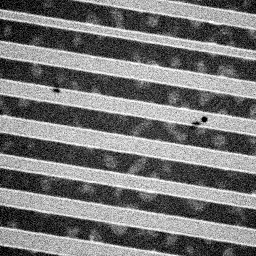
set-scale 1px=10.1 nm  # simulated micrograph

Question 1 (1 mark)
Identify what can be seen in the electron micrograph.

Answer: parallel lines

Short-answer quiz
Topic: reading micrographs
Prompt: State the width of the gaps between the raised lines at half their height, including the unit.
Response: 141 nm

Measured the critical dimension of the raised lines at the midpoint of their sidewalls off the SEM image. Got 226 nanometers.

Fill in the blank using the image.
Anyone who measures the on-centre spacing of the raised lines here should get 361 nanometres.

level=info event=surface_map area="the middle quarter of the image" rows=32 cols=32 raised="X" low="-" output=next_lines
---------------------XXXXXXXXXXX
XXXXX-----------------------XXXX
XXXXXXXXXXX---------------------
XXXXXXXXXXXXXXXXXX--------------
XXXXXXXXXXXXXXXXXXXXXXX---------
XXXXXXXXXXXXXXXXXXXXXXXXXXXXX---
XXXXXXXXXXXXXXXXXXXXXXXXXXXXXXXX
-------XXXXXXXXXXXXXXXXXXXXXXXXX
-------------XXXXXXXXXXXXXXXXXXX
-------------------XXXXXXXXXXXXX
XXX----------------------XXXXX-X
XXXXXXXXXX---------------------X
XXXXXXXXXXXXXXXX----------------
XXXXXXXXXXXXXXXXXXXXXX----------
XXXXXXXXXXXXXXXXXXXXXXXXXXX-----
XXXXXXXXXXXXXXXXXXXXXXXXXXXXXXXX
------XXXXXXXXXXXXXXXXXXXXXXXXXX
------------XXXXXXXXXXXXXXXXXXXX
------------------XXXXXXXXXXXXXX
------------------------XXXXXXXX
XXXXXX------------------------XX
XXXXXXXXXXXXX-------------------
XXXXXXXXXXXXXXXXXXX-------------
XXXXXXXXXXXXXXXXXXXXXXXXX-------
XXXXXXXXXXXXXXXXXXXXXXXXXXXXXXX-
--XXXXXXXXXXXXXXXXXXXXXXXXXXXXXX
--------XXXXXXXXXXXXXXXXXXXXXXXX
--------------XXXXXXXXXXXXXXXXXX
X-------------------XXXXXXXXXXXX
XXXXXXX--------------------XXXXX
XXXXXXXXXXXXX-------------------
XXXXXXXXXXXXXXXXXXX-------------